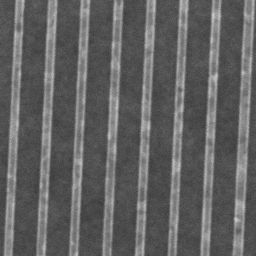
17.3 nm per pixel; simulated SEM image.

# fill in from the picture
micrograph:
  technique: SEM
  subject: parallel lines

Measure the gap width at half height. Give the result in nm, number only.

443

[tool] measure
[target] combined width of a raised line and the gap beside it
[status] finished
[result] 567 nm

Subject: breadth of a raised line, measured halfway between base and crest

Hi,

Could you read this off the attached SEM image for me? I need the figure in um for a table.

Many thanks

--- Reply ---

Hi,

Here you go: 0.121